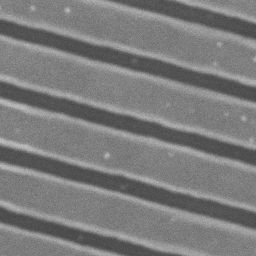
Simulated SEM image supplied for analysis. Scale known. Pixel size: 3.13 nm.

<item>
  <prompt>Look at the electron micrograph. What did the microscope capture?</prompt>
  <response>lines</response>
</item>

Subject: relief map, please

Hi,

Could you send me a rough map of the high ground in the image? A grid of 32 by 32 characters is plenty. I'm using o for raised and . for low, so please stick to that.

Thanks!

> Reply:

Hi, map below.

ooooooooooooooo........ooooooooo
oooooooooooooooooo.........ooooo
.ooooooooooooooooooooo.........o
.....ooooooooooooooooooooo......
o........ooooooooooooooooooooo..
oooo........oooooooooooooooooooo
oooooooo........oooooooooooooooo
ooooooooooo.........oooooooooooo
ooooooooooooooo........ooooooooo
ooooooooooooooooooo.........oooo
..ooooooooooooooooooooo........o
.....ooooooooooooooooooooo......
o........ooooooooooooooooooooo..
oooo.........ooooooooooooooooooo
oooooooo.........ooooooooooooooo
oooooooooooo........oooooooooooo
oooooooooooooooo........oooooooo
oooooooooooooooooooo........oooo
..oooooooooooooooooooooo.......o
......ooooooooooooooooooooo.....
o........oooooooooooooooooooooo.
ooooo........ooooooooooooooooooo
oooooooo.........ooooooooooooooo
oooooooooooo.........ooooooooooo
oooooooooooooooo........oooooooo
oooooooooooooooooooo........oooo
..ooooooooooooooooooooo.........
......ooooooooooooooooooooo.....
oo........ooooooooooooooooooooo.
oooooo........oooooooooooooooooo
ooooooooo........ooooooooooooooo
ooooooooooooo........ooooooooooo